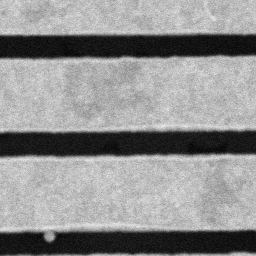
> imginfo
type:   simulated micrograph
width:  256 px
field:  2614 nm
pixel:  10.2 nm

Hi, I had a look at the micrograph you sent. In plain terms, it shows lines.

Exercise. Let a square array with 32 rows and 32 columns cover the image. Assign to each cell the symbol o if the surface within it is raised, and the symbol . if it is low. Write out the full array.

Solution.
oooooooooooooooooooooooooooooooo
oooooooooooooooooooooooooooooooo
oooooooooooooooooooooooooooooooo
oooooooooooooooooooooooooooooooo
................................
................................
................................
oooo....ooooo.oooooooooooooooooo
oooooooooooooooooooooooooooooooo
oooooooooooooooooooooooooooooooo
oooooooooooooooooooooooooooooooo
oooooooooooooooooooooooooooooooo
oooooooooooooooooooooooooooooooo
oooooooooooooooooooooooooooooooo
oooooooooooooooooooooooooooooooo
oooooooooooooooooooooooooooooooo
................................
................................
................................
............................o...
oooooooooooooooooooooooooooooooo
oooooooooooooooooooooooooooooooo
oooooooooooooooooooooooooooooooo
oooooooooooooooooooooooooooooooo
oooooooooooooooooooooooooooooooo
oooooooooooooooooooooooooooooooo
oooooooooooooooooooooooooooooooo
oooooooooooooooooooooooooooooooo
ooooooooo........ooooooooooooooo
......o.........................
................................
................................